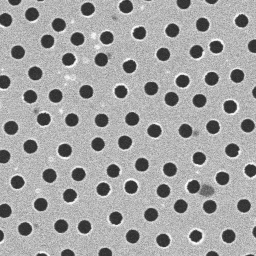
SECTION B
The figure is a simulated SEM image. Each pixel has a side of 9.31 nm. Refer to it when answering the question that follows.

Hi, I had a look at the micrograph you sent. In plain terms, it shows a regular array of holes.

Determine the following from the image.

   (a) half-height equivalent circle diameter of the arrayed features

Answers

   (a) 130 nm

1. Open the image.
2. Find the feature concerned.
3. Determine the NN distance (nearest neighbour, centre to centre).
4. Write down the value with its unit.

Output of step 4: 237 nanometers